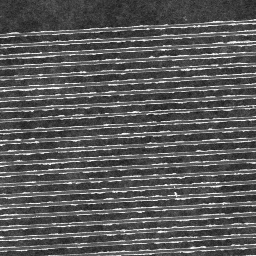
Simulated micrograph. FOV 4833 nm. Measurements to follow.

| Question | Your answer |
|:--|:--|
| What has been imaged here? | parallel lines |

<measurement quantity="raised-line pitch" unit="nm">202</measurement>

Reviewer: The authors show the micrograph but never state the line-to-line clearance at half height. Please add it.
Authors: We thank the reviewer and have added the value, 0.0542 microns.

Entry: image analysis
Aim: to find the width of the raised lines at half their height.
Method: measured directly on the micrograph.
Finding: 0.153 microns